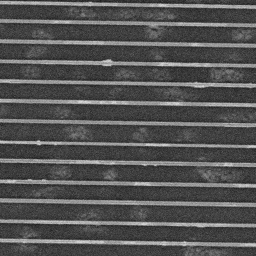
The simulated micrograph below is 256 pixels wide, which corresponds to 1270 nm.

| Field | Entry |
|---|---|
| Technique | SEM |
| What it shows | parallel lines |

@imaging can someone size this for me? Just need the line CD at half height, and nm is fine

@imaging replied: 18.6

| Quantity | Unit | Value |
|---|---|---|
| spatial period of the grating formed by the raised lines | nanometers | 98.3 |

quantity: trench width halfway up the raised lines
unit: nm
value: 79.9